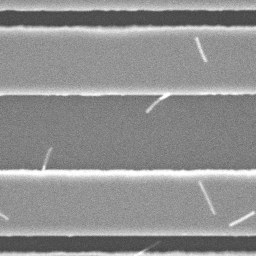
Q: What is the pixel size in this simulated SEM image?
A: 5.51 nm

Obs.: lines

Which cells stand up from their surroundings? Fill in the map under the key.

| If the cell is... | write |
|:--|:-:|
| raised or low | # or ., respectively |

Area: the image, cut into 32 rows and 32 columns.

################################
................................
................................
################################
################################
################################
################################
################################
################################
################################
################################
################################
................................
................................
................................
................................
................................
................................
................................
................................
................................
#############.#########.########
################################
################################
################################
################################
################################
################################
################################
................................
................................
.................#...##.........